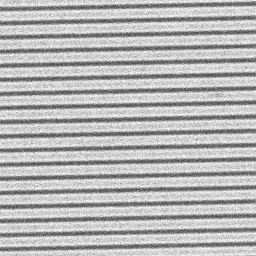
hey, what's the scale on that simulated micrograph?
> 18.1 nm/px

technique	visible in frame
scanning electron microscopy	parallel lines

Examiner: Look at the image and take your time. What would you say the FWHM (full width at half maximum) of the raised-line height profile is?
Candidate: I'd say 153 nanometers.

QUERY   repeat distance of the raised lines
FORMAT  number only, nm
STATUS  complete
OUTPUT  255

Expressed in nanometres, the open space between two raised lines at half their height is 102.